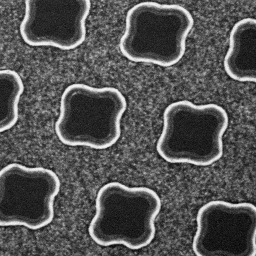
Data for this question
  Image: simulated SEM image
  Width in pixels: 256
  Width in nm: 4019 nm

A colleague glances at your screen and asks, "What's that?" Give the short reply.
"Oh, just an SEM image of raised bodies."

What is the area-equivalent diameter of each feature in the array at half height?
1010 nanometres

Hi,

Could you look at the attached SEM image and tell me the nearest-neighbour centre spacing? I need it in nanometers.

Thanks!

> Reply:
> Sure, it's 1640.